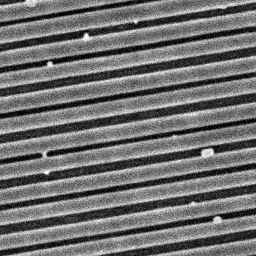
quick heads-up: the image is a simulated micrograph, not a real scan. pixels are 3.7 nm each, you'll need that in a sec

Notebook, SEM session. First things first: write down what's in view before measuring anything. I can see parallel lines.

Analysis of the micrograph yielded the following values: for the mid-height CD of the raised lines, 14.9 px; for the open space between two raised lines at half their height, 24.1 nanometers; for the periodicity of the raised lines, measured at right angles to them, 83.4 nanometres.